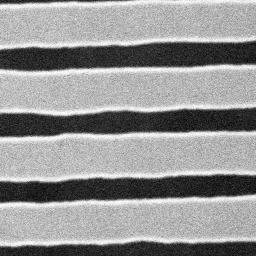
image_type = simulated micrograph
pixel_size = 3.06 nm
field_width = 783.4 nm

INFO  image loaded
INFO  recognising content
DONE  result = lines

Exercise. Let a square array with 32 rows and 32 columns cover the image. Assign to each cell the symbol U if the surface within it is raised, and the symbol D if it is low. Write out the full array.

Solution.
DDDDDDUUUUUUUUUUUUUUUUUUUUUUUUUU
UUUUUUUUUUUUUUUUUUUUUUUUUUUUUUUU
UUUUUUUUUUUUUUUUUUUUUUUUUUUUUUUU
UUUUUUUUUUUUUUUUUUUUUUUUUUUUUUUU
UUUUUUUUUUUUUUUUUUUUUUUUUUUUUUUU
UUUUUUUUUUUUUUUUUUDDDDDDDDDDDDDD
DDDDDDDDDDDDDDDDDDDDDDDDDDDDDDDD
DDDDDDDDDDDDDDDDDDDDDDDDDDDDDDDD
DDDDDDDDDDDDDDDDDDDDDDDDUUUUUUUU
UUUUUUUUUUUUUUUUUUUUUUUUUUUUUUUU
UUUUUUUUUUUUUUUUUUUUUUUUUUUUUUUU
UUUUUUUUUUUUUUUUUUUUUUUUUUUUUUUU
UUUUUUUUUUUUUUUUUUUUUUUUUUUUUUUU
UUUUUUUUUUUUUUUUUUUUUUUUUUUUUDDD
DDDDDDDDDDDDDDDDDDDDDDDDDDDDDDDD
DDDDDDDDDDDDDDDDDDDDDDDDDDDDDDDD
DDDDDDDDDDDDDDDDDDDDDDDDDDDUUDUU
UUUUUUUUUUUUUUUUUUUUUUUUUUUUUUUU
UUUUUUUUUUUUUUUUUUUUUUUUUUUUUUUU
UUUUUUUUUUUUUUUUUUUUUUUUUUUUUUUU
UUUUUUUUUUUUUUUUUUUUUUUUUUUUUUUU
UUUUUUUUUUUUUUUUUUUUUUUUUUUUUUUU
UUUUUUUUDDDDDDDDDDDDDDDDDDDDDDDD
DDDDDDDDDDDDDDDDDDDDDDDDDDDDDDDD
DDDDDDDDDDDDDDDDDDDDDDDDDDDDDDUU
UUUUUUUUUUUUUUUUUUUUUUUUUUUUUUUU
UUUUUUUUUUUUUUUUUUUUUUUUUUUUUUUU
UUUUUUUUUUUUUUUUUUUUUUUUUUUUUUUU
UUUUUUUUUUUUUUUUUUUUUUUUUUUUUUUU
UUUUUUUUUUUUUUUUUUUUUUUUUUUUUUUU
UUUUUUUUDUDDUUDDDDDDDDDDDDDDDDDD
DDDDDDDDDDDDDDDDDDDDDDDDDDDDDDDD